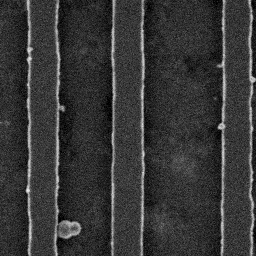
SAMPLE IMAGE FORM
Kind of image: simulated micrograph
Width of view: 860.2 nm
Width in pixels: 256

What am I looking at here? lines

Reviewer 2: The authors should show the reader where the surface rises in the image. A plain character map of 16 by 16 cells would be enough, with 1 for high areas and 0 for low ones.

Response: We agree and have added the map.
0011000110000011
0011000110000011
0011000110000011
0011000110000011
0011000110000011
0011000110000011
0011000110000011
0011000110000011
0011000110000011
0011000110000011
0011000110000011
0011000110000011
0011000110000011
0011000110000011
0011000110000011
0011000110000011